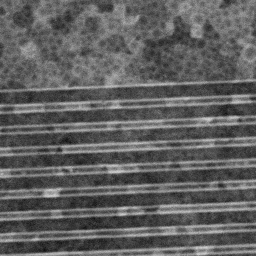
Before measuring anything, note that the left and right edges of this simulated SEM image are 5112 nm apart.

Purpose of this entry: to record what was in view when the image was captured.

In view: parallel lines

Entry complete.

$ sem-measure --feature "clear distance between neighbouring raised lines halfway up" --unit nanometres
309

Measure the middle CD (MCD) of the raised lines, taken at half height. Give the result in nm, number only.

117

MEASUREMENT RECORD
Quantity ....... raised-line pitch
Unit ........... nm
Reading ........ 427